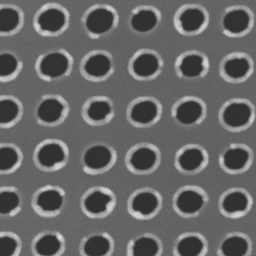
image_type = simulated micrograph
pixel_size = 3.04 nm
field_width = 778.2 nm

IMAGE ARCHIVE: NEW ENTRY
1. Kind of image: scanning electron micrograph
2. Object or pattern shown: a regular array of holes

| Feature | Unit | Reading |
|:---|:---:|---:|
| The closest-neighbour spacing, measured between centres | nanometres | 135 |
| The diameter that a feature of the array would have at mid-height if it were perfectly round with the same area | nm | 71.3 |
